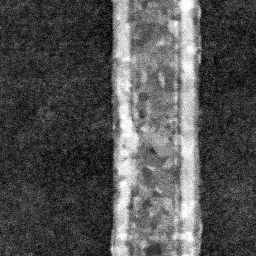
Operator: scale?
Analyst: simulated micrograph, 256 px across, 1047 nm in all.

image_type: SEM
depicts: one or a few lines or trenches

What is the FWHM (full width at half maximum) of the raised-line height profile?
0.265 microns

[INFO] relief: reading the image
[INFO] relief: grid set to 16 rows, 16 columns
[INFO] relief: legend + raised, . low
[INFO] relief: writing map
........++++....
........++++....
........++++....
........++++....
........++++....
........++++....
........++++....
........++++....
........++++....
........++++....
........++++....
........++++....
........++++....
........++++....
........++++....
........++++....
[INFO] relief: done